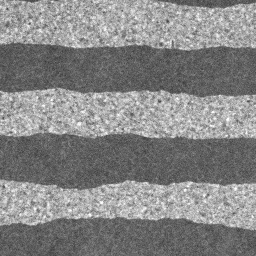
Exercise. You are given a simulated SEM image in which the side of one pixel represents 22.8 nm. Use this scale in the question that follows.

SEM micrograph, one or a few lines or trenches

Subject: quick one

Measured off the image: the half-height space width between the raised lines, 1070 nanometers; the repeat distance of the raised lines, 2020 nm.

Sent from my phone